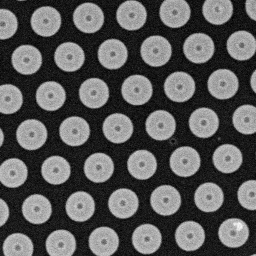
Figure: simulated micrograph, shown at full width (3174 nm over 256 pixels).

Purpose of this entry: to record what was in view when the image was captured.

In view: an array of small figures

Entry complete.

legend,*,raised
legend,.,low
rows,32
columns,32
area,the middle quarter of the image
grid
****......****........**........
***.............................
...........................****.
................*****.....******
.....*****.....******....*******
....*******....*******...*******
....*******...********...*******
....*******....*******...*******
....*******....******.....******
.....*****......*****...........
......****......................
................................
............**........*****.....
.***.......*****.....******....*
******....*******....*******...*
******....*******....*******...*
******....*******....*******....
******....*******....******.....
******.....*****......****......
*****.......***.................
................................
............................****
.......***.......*****.....*****
......*****.....*******....*****
*....*******....*******....*****
*....*******....*******....*****
*....*******....*******....*****
*....*******.....*****......****
*.....*****.......***...........
........*.......................
........................**......
.............***.......*****....